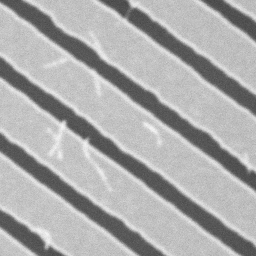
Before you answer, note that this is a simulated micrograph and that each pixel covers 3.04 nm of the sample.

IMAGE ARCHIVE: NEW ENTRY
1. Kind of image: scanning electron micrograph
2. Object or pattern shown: lines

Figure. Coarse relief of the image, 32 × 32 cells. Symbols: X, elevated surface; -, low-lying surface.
----XXXXXXXXX---XXXXXXXXXX---XXX
XX---XXXXXXXXXX---XXXXXXXXX---XX
XXX----XXXXXXXXX---XXXXXXXXX----
XXXX---XXXXXXXXXX----XXXXXXXXX--
XXXXXX---XXXXXXXXXX---XXXXXXXXX-
XXXXXXX----XXXXXXXXX---XXXXXXXXX
XXXXXXXX----XXXXXXXXX----XXXXXXX
-XXXXXXXXX---XXXXXXXXXX---XXXXXX
--XXXXXXXXX----XXXXXXXXX---XXXXX
---XXXXXXXXXX---XXXXXXXXX----XXX
X---XXXXXXXXXX---XXXXXXXXX----XX
XXX---XXXXXXXXX----XXXXXXXXX---X
XXXX---XXXXXXXXX----XXXXXXXXX---
XXXXX----XXXXXXXXX---XXXXXXXXXX-
XXXXXXX---XXXXXXXXX----XXXXXXXXX
XXXXXXXX---XXXXXXXXXX---XXXXXXXX
XXXXXXXXX---XXXXXXXXXX----XXXXXX
-XXXXXXXXXX---XXXXXXXXX----XXXXX
---XXXXXXXXX---XXXXXXXXXX---XXXX
X---XXXXXXXXX----XXXXXXXXX---XXX
XX---XXXXXXXXXX---XXXXXXXXX---XX
XXX----XXXXXXXXX----XXXXXXXXX---
XXXXX---XXXXXXXXX----XXXXXXXXX--
XXXXXX---XXXXXXXXXX---XXXXXXXXX-
XXXXXXX----XXXXXXXXX---XXXXXXXXX
XXXXXXXXX---XXXXXXXXX----XXXXXXX
-XXXXXXXXX---XXXXXXXXXX---XXXXXX
--XXXXXXXXX----XXXXXXXXX----XXXX
----XXXXXXXXX---XXXXXXXXX----XXX
X----XXXXXXXXX----XXXXXXXXX---XX
XXX---XXXXXXXXX----XXXXXXXXX----
XXXX----XXXXXXXXX---XXXXXXXXX---